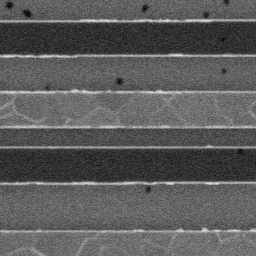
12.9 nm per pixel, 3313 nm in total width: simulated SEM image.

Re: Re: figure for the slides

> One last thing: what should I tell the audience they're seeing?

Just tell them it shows lines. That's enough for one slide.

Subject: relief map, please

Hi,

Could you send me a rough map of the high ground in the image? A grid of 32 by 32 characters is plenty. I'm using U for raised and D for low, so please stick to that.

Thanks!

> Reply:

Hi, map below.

DDDDDDDDDDDDDDDDDDDDDDDDDDDDDDDD
DDDDDDDDDDDDDDDDDDDDDDDDDDDDDDDD
DDDDDDDDDDDDDDDDDDDDDDDDDDDDDDDD
UUUUUUUUUUUUUUUUUUUUUUUUUUUUUUUU
UUUUUUUUUUUUUUUUUUUUUUUUUUUUUUUU
UUUUUUUUUUUUUUUUUUUUUUUUUUUUUUUU
UUUUUUUUUUUUUUUUUUUUUUUUUUUUUUUU
DDDDDDDDDDDDDDDDDDDDDDDDDDDDDDDD
DDDDDDDDDDDDDDDDDDDDDDDDDDDDDDDD
DDDDDDDDDDDDDDDDDDDDDDDDDDDDDDDD
DDDDDDDDDDDDDDDDDDDDDDDDDDDDDDDD
DDDDDDDDDDDDDDDDDDDDDDDDDDDDDDDD
UUUUUUUUUUUUUUUUUUUUUUUUUUUUUUUU
UUUUUUUUUUUUUUUUUUUUUUUUUUUUUUUU
UUUUUUUUUUUUUUUUUUUUUUUUUUUUUUUU
UUUUUUUUUUUUUUUUUUUUUUUUUUUUUUUU
DDDDDDDDDDDDDDDDDDDDDDDDDDDDDDDD
DDDDDDDDDDDDDDDDDDDDDDDDDDDDDDDD
UUUUUUUUUUUUUUUUUUUUUUUUUUUUUUUU
UUUUUUUUUUUUUUUUUUUUUUUUUUUUUUUU
UUUUUUUUUUUUUUUUUUUUUUUUUUUUUUUU
UUUUUUUUUUUUUUUUUUUUUUUUUUUUUUUU
UUUUUUUUUUUUUUUUUUUUUUUUUUUUUUUU
DDDDDDDDDDDDDDDDDDDDDDDDDDDDDDDD
DDDDDDDDDDDDDDDDDDDDDDDDDDDDDDDD
DDDDDDDDDDDDDDDDDDDDDDDDDDDDDDDD
DDDDDDDDDDDDDDDDDDDDDDDDDDDDDDDD
DDDDDDDDDDDDDDDDDDDDDDDDDDDDDDDD
DDDDDDDDDDDDDDDDDDDDDDDDDDDDDDDD
UUUUUUUUUUUUUUUUUUUUUUUUUUUUUUUU
UUUUUUUUUUUUUUUUUUUUUUUUUUUUUUUU
UUUUUUUUUUUUUUUUUUUUUUUUUUUUUUUU